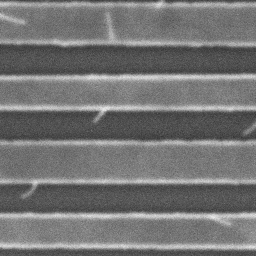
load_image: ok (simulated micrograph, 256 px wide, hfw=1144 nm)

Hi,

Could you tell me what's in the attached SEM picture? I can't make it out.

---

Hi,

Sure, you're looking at lines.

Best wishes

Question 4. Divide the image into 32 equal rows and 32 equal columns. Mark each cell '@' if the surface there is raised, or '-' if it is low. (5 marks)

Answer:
@@@@@@@@@@@@@@@@@@@@@@@@@@@@@@@@
@@@@@@@@@@@@@@@@@@@@@@@@@@@@@@@@
@@@@@@@@@@@@@@@@@@@@@@@@@@@@@@@@
@@@@@@@@@@@@@@@@@@@@@@@@@@@@@@@@
@@@@@@@@@@@@@@@@@@@@@@@@@@@@@@@@
-------@@------@@@@@@@@@@@@@@@@@
--------------------------------
--------------------------------
--------------------------------
---------------------------@@@@@
@@@@@@@@@@@@@@@@@@@@@@@@@@@@@@@@
@@@@@@@@@@@@@@@@@@@@@@@@@@@@@@@@
@@@@@@@@@@@@@@@@@@@@@@@@@@@@@@@@
@@@@@@@@@@@@@@@@@@@@@@@@@@@@@@@@
--------------------------------
--------------------------------
--------------------------------
--------------------------------
@@@@@@@@@@@@@@@@@@@@@@@@@@@@@@@@
@@@@@@@@@@@@@@@@@@@@@@@@@@@@@@@@
@@@@@@@@@@@@@@@@@@@@@@@@@@@@@@@@
@@@@@@@@@@@@@@@@@@@@@@@@@@@@@@@@
@@@@@@@@@@@@@@@@@@@@@@@@@@@@@@@@
--------------------------------
--------------------------------
--------------------------------
--------------------------------
@@@@@@@@@@@@@@@@@@@@@@@@@@@@@@@@
@@@@@@@@@@@@@@@@@@@@@@@@@@@@@@@@
@@@@@@@@@@@@@@@@@@@@@@@@@@@@@@@@
@@@@@@@@@@@@@@@@@@@@@@@@@@@@@@@@
--------------------------------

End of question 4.